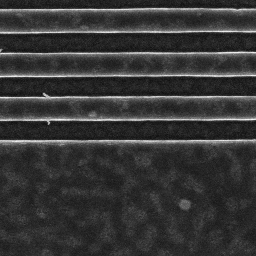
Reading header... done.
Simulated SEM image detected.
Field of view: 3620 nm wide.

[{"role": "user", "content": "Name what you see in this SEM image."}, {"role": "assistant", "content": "parallel lines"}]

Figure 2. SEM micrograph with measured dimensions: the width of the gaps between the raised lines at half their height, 284 nm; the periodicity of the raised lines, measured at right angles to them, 620 nm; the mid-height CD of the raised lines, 0.325 µm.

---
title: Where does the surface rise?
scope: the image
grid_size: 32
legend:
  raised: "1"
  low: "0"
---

00000000000000000000000000000000
11111111111111111111111111111111
11111111111111111111111111111111
11111111111111111111111111111111
00000000000000000000000000000000
00000000000000000000000000000000
00000000000000000000000000000000
11111111111111111111111111111111
11111111111111111111111111111111
10011111111111001110000000000000
00000000000000000000000000000000
00000000000000000000000000000000
11111111111111111111111111111111
11111111111111111111111111111111
11111111111111111111111111111111
00000000000000000000000000000000
00000000000000000000000000000000
00000000000000000000000000000001
11111111111111111111111111111111
11111111111111111111111111111111
11111111111111111111111111111111
11111111111111111111111111111111
11111111111111111111111111111111
11111111111111111111111111111111
11111111111111111111111111111111
11111111111111111111111111111111
11111111111111111111111111111111
11111111111111111111111111111111
11111111111111111111111111111111
11111111111111111111111111111111
11111111111111111111111111111111
11111111111111111111111111111111